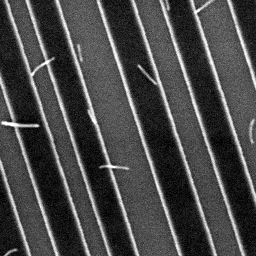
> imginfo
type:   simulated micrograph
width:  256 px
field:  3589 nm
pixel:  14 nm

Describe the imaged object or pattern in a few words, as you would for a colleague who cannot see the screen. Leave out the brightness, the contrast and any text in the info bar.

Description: lines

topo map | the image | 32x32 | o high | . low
o..oooo.....ooooo...oooo.....ooo
o...oooo.....oooo...ooooo....ooo
oo..oooo.....oooo....oooo....ooo
oo..oooo.....ooooo...oooo.....oo
oo...oooo.....oooo...oooo.....oo
ooo..oooo.....oooo....oooo....oo
ooo..oooo.....ooooo...oooo.....o
ooo...oooo.....oooo...oooo.....o
oooo..oooo.....oooo....oooo....o
oooo..oooo.....ooooo...oooo.....
oooo...oooo.....oooo...oooo.....
ooooo..oooo.....oooo....oooo....
.oooo..oooo.....ooooo...oooo....
.oooo...oooo.....oooo...oooo....
.ooooo..oooo.....oooo....oooo...
.ooooo..oooo.....ooooo...oooo...
..oooo...ooo.....ooooo...oooo...
..ooooo..oooo.....oooo....oooo..
...oooo..oooo.....ooooo...oooo..
...oooo...ooo.....ooooo...oooo..
...oooo...oooo.....oooo....oooo.
....oooo..oooo.....ooooo...oooo.
o...oooo...ooo.....ooooo...oooo.
o...ooooo..oooo.....oooo....oooo
o....oooo..oooo.....ooooo...oooo
oo...oooo...ooo.....ooooo...oooo
oo...oooo...oooo.....oooo....ooo
oo....oooo..oooo.....ooooo...ooo
ooo...oooo...ooo.....ooooo...ooo
ooo...oooo...oooo.....oooo....oo
ooo....oooo..oooo.....ooooo...oo
oooo...oooo...ooo.....ooooo...oo